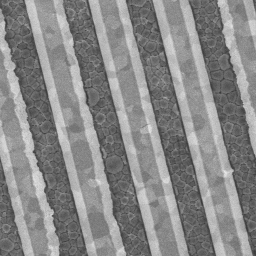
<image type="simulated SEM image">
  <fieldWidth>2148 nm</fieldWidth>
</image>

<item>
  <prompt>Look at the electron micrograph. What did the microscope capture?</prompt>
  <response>one or a few lines or trenches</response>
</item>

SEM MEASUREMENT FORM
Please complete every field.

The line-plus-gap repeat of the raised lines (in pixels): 61.9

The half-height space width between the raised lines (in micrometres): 0.285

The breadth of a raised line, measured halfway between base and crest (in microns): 0.232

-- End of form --